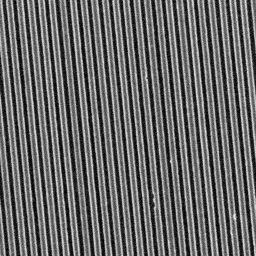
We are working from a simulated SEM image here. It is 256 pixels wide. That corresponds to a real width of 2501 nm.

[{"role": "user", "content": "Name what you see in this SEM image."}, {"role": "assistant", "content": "parallel lines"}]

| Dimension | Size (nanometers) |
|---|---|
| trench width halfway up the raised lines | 46.1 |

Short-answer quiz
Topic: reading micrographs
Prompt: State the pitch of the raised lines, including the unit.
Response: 103 nanometres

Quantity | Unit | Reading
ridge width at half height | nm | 54.6